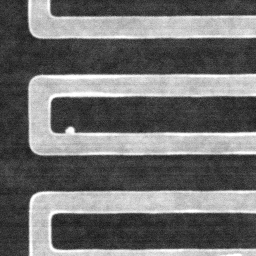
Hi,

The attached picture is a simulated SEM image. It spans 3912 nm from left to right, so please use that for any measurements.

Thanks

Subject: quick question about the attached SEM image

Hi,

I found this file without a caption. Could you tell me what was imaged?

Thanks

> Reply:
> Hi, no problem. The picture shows groups of lines, slits or small figures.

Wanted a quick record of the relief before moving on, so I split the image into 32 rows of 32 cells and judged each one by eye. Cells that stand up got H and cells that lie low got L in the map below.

LLLLHHLLLLLLLLLLLLLLLLLLLLLLLLLL
LLLLHHLLLLLLLLLLLLLLLLLLLLLLLLLL
LLLLHHHHHHHHHHHHHHHHHHHHHHHHHHHH
LLLLHHHHHHHHHHHHHHHHHHHHHHHHHHHH
LLLLHHHHHHHHHHHHHHHHHHHHHHHHHHHH
LLLLLLLLLLLLLLLLLLLLLLLLLLLLLLLL
LLLLLLLLLLLLLLLLLLLLLLLLLLLLLLLL
LLLLLLLLLLLLLLLLLLLLLLLLLLLLLLLL
LLLLLLLLLLLLLLLLLLLLLLLLLLLLLLLL
LLLLLLLLLLLLLLLLLLLLLHHHLLLLHHHH
LLLLHHHHHHHHHHHHHHHHHHHHHHHHHHHH
LLLLHHHHHHHHHHHHHHHHHHHHHHHHHHHH
LLLLHHLLLLLLLLLLLLLLLLLLLLLLLLLL
LLLLHHLLLLLLLLLLLLLLLLLLLLLLLLLL
LLLLHHLLLLLLLLLLLLLLLLLLLLLLLLLL
LLLLHHLLLLLLLLLLLLLLLLLLLLLLLLLL
LLLLHHHLLLLLLLLLLLLLLLLLLLLLLLLL
LLLLHHHHHHHHHHHHHHHHHHHHHHHHHHHH
LLLLHHHHHHHHHHHHHHHHHHHHHHHHHHHH
LLLLLLLLLLLLLLLLLLLLLLLLLLLLLLLL
LLLLLLLLLLLLLLLLLLLLLLLLLLLLLLLL
LLLLLLLLLLLLLLLLLLLLLLLLLLLLLLLL
LLLLLLLLLLLLLLLLLLLLLLLLLLLLLLLL
LLLLLLLLLLLLLLLLLLLLLLLLLLLLLLLL
LLLLHHHHHHHHHHHHHHHHHHHHHHHHHHHH
LLLLHHHHHHHHHHHHHHHHHHHHHHHHHHHH
LLLLHHHLHHHHHHHHHHHHHHLLLLLLLLLH
LLLLHHLLLLLLLLLLLLLLLLLLLLLLLLLL
LLLLHHLLLLLLLLLLLLLLLLLLLLLLLLLL
LLLLHHLLLLLLLLLLLLLLLLLLLLLLLLLL
LLLLHHLLLLLLLLLLLLLLLLLLLLLLLLLL
LLLLHHHHHHHHHHHHHHHHHHHHHHHHHHHH